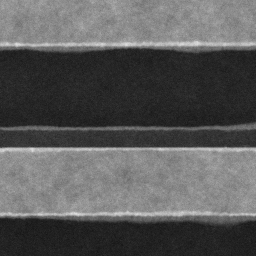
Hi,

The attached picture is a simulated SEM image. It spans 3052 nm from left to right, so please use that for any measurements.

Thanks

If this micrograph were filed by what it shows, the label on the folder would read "lines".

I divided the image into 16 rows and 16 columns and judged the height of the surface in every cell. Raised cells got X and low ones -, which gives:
XXXXXXXXXXXXXXXX
XXXXXXXXXXXXXXXX
XXXXXXXXXXXXXXXX
----------------
----------------
----------------
----------------
----------------
----------------
XXXXXXXXXXXXXXXX
XXXXXXXXXXXXXXXX
XXXXXXXXXXXXXXXX
XXXXXXXXXXXXXXXX
----------------
----------------
----------------